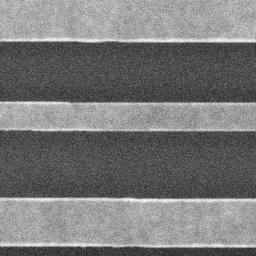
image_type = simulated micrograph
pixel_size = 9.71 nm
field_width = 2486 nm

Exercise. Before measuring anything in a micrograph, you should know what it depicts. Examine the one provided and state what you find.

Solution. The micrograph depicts lines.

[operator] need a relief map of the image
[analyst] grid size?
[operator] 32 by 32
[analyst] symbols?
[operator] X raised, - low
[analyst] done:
XXXXXXXXXXXXXXXXXXXXXXXXXXXXXXXX
XXXXXXXXXXXXXXXXXXXXXXXXXXXXXXXX
XXXXXXXXXXXXXXXXXXXXXXXXXXXXXXXX
XXXXXXXXXXXXXXXXXXXXXXXXXXXXXXXX
XXXXXXXXXXXXXXXXXXXXXXXXXXXXXXXX
--------------------------------
--------------------------------
--------------------------------
--------------------------------
--------------------------------
--------------------------------
--------------------------------
--------------------------------
XXXXXXXXXXXXXXXXXXXXXXXXXXXXXXXX
XXXXXXXXXXXXXXXXXXXXXXXXXXXXXXXX
XXXXXXXXXXXXXXXXXXXXXXXXXXXXXXXX
--------------------------------
--------------------------------
--------------------------------
--------------------------------
--------------------------------
--------------------------------
--------------------------------
--------------------------------
--------------------------------
XXXXXXXXXXXXXXXXXXXXXXXXXXXXXXXX
XXXXXXXXXXXXXXXXXXXXXXXXXXXXXXXX
XXXXXXXXXXXXXXXXXXXXXXXXXXXXXXXX
XXXXXXXXXXXXXXXXXXXXXXXXXXXXXXXX
XXXXXXXXXXXXXXXXXXXXXXXXXXXXXXXX
XXXXXXXXXXXXXXXXXXXXXXXXXXXXXXXX
--------------------------------